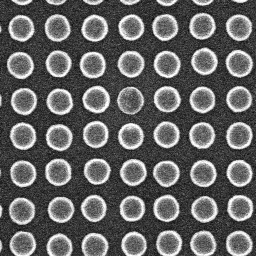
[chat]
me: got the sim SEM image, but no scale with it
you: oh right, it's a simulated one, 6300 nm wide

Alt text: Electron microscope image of a regular array of raised bodies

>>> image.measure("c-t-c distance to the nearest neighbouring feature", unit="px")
35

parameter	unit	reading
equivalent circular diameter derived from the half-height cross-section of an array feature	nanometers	608